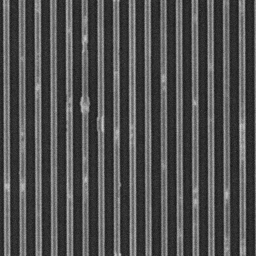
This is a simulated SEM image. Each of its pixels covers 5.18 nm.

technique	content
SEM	parallel lines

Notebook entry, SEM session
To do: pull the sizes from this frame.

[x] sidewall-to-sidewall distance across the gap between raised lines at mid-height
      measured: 53.1 nm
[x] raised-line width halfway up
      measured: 26.6 nanometres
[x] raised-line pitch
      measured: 81.4 nanometres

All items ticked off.